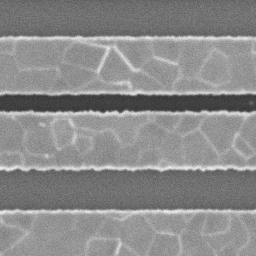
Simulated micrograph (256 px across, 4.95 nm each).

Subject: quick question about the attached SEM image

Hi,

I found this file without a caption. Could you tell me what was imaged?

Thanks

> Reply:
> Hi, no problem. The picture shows lines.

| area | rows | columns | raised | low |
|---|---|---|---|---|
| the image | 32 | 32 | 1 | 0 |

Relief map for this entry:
00000000000000000000000000000000
00000000000000000000000000000000
00000000000000000000000000000000
00000000000000000000000000000000
00000000000000000000000000000000
11111111111111111111111111111111
11111111111111111111111111111111
11111111111111111111111111111111
11111111111111111111111111111111
11111111111111111111111111111111
11111111111111111111111111111111
11111111111111111111111111111111
00000000000000000000000000000000
00000000000000000000000000000000
11111111111111111111111111111111
11111111111111111111111111111111
11111111111111111111111111111111
11111111111111111111111111111111
11111111111111111111111111111111
11111111111111111111111111111111
11111111111111111111111111111111
00000000000000000000000000000000
00000000000000000000000000000000
00000000000000000000000000000000
00000000000000000000000000000000
00000000000000000000000000000000
11111111111111111111111111111111
11111111111111111111111111111111
11111111111111111111111111111111
11111111111111111111111111111111
11111111111111111111111111111111
11111111111111111111111111111111